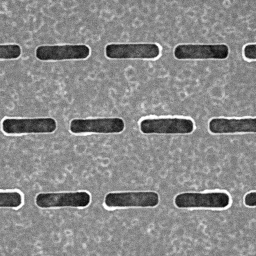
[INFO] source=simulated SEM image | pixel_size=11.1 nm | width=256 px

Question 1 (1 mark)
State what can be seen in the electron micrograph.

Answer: a regular array of holes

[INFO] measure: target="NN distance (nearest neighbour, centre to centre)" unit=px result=69